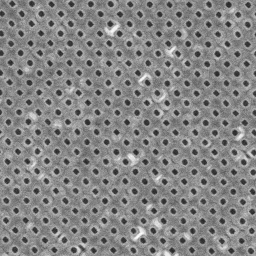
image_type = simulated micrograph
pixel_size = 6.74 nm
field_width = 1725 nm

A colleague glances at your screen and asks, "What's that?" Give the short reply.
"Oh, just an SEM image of a regular array of holes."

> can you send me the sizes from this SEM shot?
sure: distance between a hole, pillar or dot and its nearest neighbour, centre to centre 91.5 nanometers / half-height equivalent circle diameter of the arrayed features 0.0423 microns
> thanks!